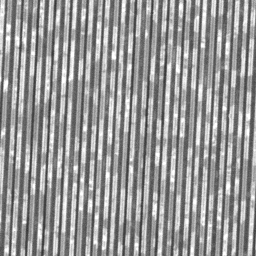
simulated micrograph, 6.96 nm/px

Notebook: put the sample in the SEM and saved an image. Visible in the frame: parallel lines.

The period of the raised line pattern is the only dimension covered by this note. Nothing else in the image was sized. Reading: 56.5 nanometres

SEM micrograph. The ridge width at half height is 26.1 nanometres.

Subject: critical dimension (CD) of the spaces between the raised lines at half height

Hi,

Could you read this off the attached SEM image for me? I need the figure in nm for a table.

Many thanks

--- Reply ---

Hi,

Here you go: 33